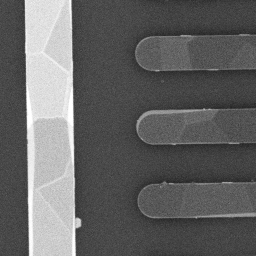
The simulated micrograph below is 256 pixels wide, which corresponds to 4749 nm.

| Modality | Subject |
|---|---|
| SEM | groups of lines, slits or small figures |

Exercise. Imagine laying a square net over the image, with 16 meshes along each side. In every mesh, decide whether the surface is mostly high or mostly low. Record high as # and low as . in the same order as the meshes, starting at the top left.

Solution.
..##............
..##............
..##.....#######
..##.....#######
..##............
..##............
..##............
..##.....#######
..##.....#######
..###...........
..###...........
..###.....######
..###....#######
..###....#####..
..###...........
..###...........